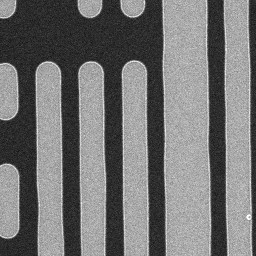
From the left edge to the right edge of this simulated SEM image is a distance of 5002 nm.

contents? groups of lines, slits or small figures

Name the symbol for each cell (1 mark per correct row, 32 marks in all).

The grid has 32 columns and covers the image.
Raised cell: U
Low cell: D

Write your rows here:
DDUUUUUUUUDDDUUDDDUUDDDDDDUUDDDU
DDUUUUUUUUDDUUUUDDUUDDDDDDUUDDDU
UUUUUUUUUUUUUUUUUUUUDDDDDDUUDDDU
UUUUUUUUUUUUUUUUUUUUDDDDDDUUDDDU
UUUUUUUUUUUUUUUUUUUUUDDDDDUUDDDU
UUUUUUUUUUUUUUUUUUUUUDDDDDUUDDDU
UUUUUUUUUUUUUUUUUUUUUDDDDDUUDDDU
UUUUUUUUUUUUUUUUUUUUDDDDDDUUDDDU
DDUUUDDUUUDDDUUUDDUUDDDDDDUUDDDU
DDUUUDDDUUDDDUUDDDUUDDDDDDUUDDDU
DDUUUDDDUUDDDUUDDDUUUDDDDDUUDDDU
DDUUUDDDUUDDDUUDDDUUUDDDDDUUDDDU
DDUUUDDDUUDDDUUDDDUUUDDDDDUUDDDU
DDUUUDDDUUDDDUUDDDUUUDDDDDUUDDDU
DDUUUDDDUUDDDUUDDDUUUDDDDDUUDDDU
UUUUUDDDUUDDDUUDDDUUUDDDDDUUDDDU
UUUUUDDDUUDDDUUDDDUUUDDDDDUUDDDU
UUUUUDDDUUDDDUUDDDUUUDDDDDUUDDDU
UUUUUDDDUUDDDUUDDDUUUDDDDDUUDDDU
UUUUUDDDUUDDDUUDDDUUUDDDDDUUDDDU
UUUUUDDDUUDDDUUDDDUUUDDDDDUUDDDU
DDUUUDDDUUDDDUUDDDUUUDDDDDUUDDDU
DDUUUDDDUUDDDUUDDDUUUDDDDDUUDDDU
DDUUUDDDUUDDDUUDDDUUUDDDDDUUDDDU
DDUUUDDDUUDDDUUDDDUUUDDDDDUUDDDU
DDUUUDDDUUDDDUUDDDUUUDDDDDUUDDDU
DDUUUDDDUUDDDUUUDDUUUDDDDDUUDDDU
DDUUUDDDUUDDDUUUDDUUUDDDDDUUDDDU
DDUUUDDDUUDDDUUUDDUUUDDDDDUUDDDU
DDUUUDDDUUDDDUUUDDUUUDDDDDUUDDDU
UUUUUDDDUUDDDUUUDDUUUDDDDDUUDDDU
UUUUUDDDUUDDDUUUDDDUUDDDDDUUUDDU